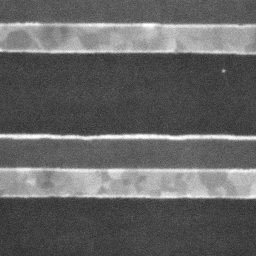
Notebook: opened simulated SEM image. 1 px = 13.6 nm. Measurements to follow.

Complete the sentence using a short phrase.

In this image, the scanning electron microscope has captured lines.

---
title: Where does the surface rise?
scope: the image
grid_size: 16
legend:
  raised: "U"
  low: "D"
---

UUUUUUUUUUUUUUUU
UUUUUUUUUUUUUUUU
UUUUUUUUUUUUUUUU
DDDDDDDDDDDDDDDD
DDDDDDDDDDDDDDDD
DDDDDDDDDDDDDDDD
DDDDDDDDDDDDDDDD
DDDDDDDDDDDDDDDD
DDDDDDDDDDDDDDDD
UUUUUUUUUUUUUUUU
UUUUUUUUUUUUUUUU
UUUUUUUUUUUUUUUU
DDDDDDDDDDDDDDDD
DDDDDDDDDDDDDDDD
DDDDDDDDDDDDDDDD
DDDDDDDDDDDDDDDD